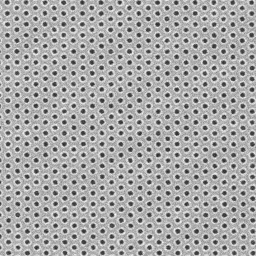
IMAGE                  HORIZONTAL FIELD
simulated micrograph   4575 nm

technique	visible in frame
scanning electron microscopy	a regular array of holes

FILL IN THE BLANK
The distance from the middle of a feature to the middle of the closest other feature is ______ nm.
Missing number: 190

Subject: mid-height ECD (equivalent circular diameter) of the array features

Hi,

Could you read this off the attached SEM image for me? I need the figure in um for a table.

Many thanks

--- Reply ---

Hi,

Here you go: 0.101